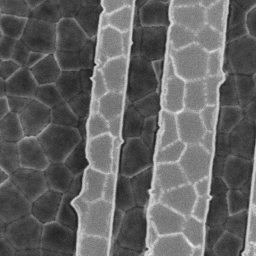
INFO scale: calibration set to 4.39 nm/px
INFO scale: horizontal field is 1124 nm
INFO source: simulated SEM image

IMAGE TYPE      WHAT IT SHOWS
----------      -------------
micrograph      one or a few lines or trenches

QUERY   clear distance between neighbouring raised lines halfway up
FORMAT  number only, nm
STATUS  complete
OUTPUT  165